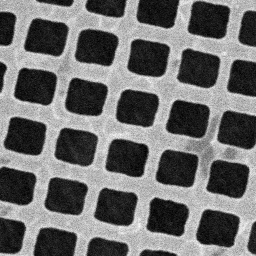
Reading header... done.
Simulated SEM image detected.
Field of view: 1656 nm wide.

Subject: a regular array of holes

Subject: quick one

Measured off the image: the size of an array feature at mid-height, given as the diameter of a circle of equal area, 0.265 µm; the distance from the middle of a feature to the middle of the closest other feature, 50.6 pixels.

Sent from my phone